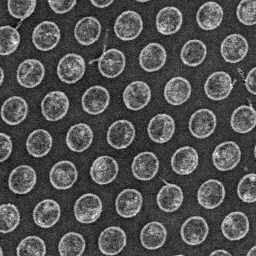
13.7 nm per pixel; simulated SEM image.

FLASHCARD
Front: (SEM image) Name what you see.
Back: a regular array of raised bodies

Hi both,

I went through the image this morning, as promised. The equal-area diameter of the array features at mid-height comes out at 364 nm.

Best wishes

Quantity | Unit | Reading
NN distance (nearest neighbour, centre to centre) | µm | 0.552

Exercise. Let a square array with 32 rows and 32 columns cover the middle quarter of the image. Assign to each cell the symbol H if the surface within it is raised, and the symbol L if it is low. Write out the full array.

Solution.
HHHHHLLLLHHHHHHLLLLLHHHHLLLLLLLL
HHHHHLLLLHHHHHHLLLLLLHHLLLLLLLLL
HHHHHLLLLLHHHHLLLLLLLLLLLLLLLLLL
HHHHLLLLLLLLLLLLLLLLLLLLLLLLLLLL
LLLLLLLLLLLLLLLLLLLLLLLLLLHHHHHL
LLLLLLLLLLLLLLLLHHHHHLLLLLHHHHHL
LLLLLLHHHHLLLLLHHHHHHLLLLHHHHHHL
LLLLLHHHHHHLLLLHHHHHHLLLLHHHHHHL
LLLLLHHHHHHLLLLHHHHHHLLLLLHHHHHL
HLLLLHHHHHHLLLLHHHHHHLLLLLLHHHLL
HLLLLHHHHHHLLLLLHHHHLLLLLLLLLLLL
HLLLLHHHHHLLLLLLLLLLLLLLLLLLLLLL
LLLLLLLLLLLLLLLLLLLLLLLLLLLLLLLL
LLLLLLLLLLLLLLLLLLLLLLLHHHLLLLLL
LLLLLLLLLLLLLHHHLLLLLLHHHHHLLLLH
LLLHHHLLLLLLHHHHHLLLLHHHHHHLLLLL
LHHHHHLLLLLHHHHHHLLLLHHHHHHLLLLL
LHHHHHHLLLLHHHHHHLLLLHHHHHHLLLLL
LHHHHHHLLLLHHHHHHLLLLLHHHHLLLLLL
LHHHHHHLLLLHHHHHHLLLLLLLHLLLLLLL
LHHHHHLLLLLLHHHLLLLLLLLLLLLLLLLL
LLHHHLLLLLLLLLLLLLLLLLLLLLLLLHHH
LLLLLLLLLLLLLLLLLLLHHHLLLLLLHHHH
LLLLLLLLLHHHLLLLLLHHHHHLLLLHHHHH
HLLLLLLLHHHHHLLLLHHHHHHLLLLHHHHH
HHLLLLLHHHHHHLLLLHHHHHHLLLLHHHHH
HHHLLLLHHHHHHLLLLHHHHHHLLLLLHHHH
HHHLLLLHHHHHHLLLLLHHHHHLLLLLLLLL
HHHLLLLHHHHHHLLLLLLHHHLLLLLLLLLL
HHLLLLLLHHHLLLLLLLLLLLLLLLLLLLLL
HHLLLLLLLLLLLLLLLLLLLLLLLHHHLLLL
LLLLLLLLLLLLLLLLHLLLLLLLHHHHHLLL